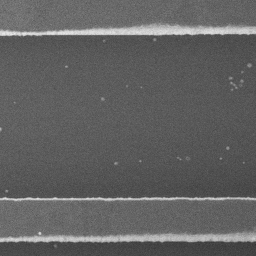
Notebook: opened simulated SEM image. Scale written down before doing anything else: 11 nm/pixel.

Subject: lines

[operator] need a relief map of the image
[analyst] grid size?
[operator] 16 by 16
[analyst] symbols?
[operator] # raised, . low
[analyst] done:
################
################
................
................
................
................
................
................
................
................
................
................
################
################
################
................